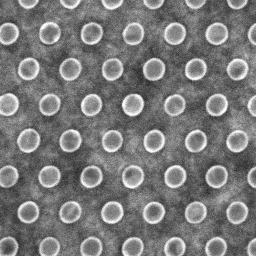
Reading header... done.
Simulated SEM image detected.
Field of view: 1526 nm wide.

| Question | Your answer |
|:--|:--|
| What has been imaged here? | a regular array of raised bodies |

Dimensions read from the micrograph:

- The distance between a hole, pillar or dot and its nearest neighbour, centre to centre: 245 nm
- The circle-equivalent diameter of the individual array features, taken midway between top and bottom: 124 nanometres